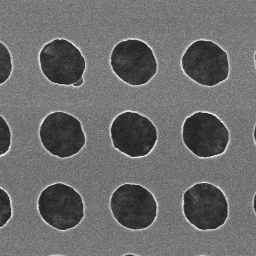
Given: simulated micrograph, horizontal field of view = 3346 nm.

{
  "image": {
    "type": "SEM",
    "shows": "a regular array of holes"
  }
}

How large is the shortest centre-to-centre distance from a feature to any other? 938 nanometers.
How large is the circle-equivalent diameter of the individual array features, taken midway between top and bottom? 594 nm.